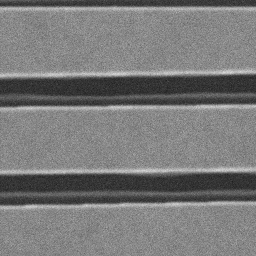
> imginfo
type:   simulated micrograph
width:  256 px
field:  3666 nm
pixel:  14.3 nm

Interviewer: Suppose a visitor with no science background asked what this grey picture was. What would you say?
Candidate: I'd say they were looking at lines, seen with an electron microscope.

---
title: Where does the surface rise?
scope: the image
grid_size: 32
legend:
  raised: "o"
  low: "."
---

................................
oooooooooooooooooooooooooooooooo
oooooooooooooooooooooooooooooooo
oooooooooooooooooooooooooooooooo
oooooooooooooooooooooooooooooooo
oooooooooooooooooooooooooooooooo
oooooooooooooooooooooooooooooooo
oooooooooooooooooooooooooooooooo
oooooooooooooooooooooooooooooooo
o...............................
................................
................................
................................
oooooooooooooooooooooooooooooooo
oooooooooooooooooooooooooooooooo
oooooooooooooooooooooooooooooooo
oooooooooooooooooooooooooooooooo
oooooooooooooooooooooooooooooooo
oooooooooooooooooooooooooooooooo
oooooooooooooooooooooooooooooooo
oooooooooooooooooooooooooooooooo
oooooooooo......................
................................
................................
................................
...............ooooooooooooooooo
oooooooooooooooooooooooooooooooo
oooooooooooooooooooooooooooooooo
oooooooooooooooooooooooooooooooo
oooooooooooooooooooooooooooooooo
oooooooooooooooooooooooooooooooo
oooooooooooooooooooooooooooooooo